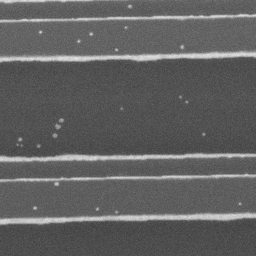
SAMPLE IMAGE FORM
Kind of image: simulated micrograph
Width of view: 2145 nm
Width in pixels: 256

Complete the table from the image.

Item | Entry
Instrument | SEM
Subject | lines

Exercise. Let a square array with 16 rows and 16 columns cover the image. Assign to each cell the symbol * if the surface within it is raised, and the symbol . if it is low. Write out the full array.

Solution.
****************
****************
****************
************.*..
................
................
................
................
................
................
****************
****************
****************
**************..
................
................